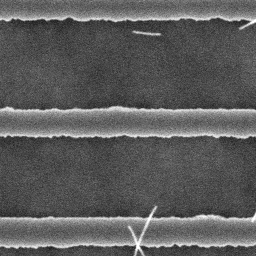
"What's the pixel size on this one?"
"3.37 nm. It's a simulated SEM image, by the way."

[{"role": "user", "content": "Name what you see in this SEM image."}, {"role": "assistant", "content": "lines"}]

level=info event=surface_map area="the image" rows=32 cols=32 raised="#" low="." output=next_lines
################################
################################
..........#...####..........##.#
................................
................................
................................
................................
................................
................................
................................
................................
................................
................................
................................
################################
################################
################################
................................
................................
................................
................................
................................
................................
................................
................................
................................
................................
################################
################################
################################
################################
................................